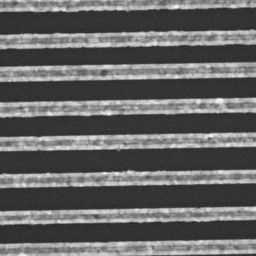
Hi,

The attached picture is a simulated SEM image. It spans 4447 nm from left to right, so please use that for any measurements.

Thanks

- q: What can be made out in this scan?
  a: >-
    parallel lines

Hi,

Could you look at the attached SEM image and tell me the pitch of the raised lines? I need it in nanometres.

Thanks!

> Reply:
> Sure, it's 607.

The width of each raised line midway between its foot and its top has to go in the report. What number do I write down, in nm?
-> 182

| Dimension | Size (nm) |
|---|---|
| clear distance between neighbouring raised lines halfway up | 419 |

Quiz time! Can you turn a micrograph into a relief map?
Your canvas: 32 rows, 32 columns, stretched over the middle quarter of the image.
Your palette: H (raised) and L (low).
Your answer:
LLLLLLLLLLLLLLLLLLLLLLLLLLHHHHHH
HHHHHHHHHHHHHHHHHHHHHHHHHHHHHHHH
HHHHHHHHHHHHHHHHHHHHHHHHHHHHHHHH
HHHHHHHLLLLLLLLLLLLLLLLLLLLLLLLL
LLLLLLLLLLLLLLLLLLLLLLLLLLLLLLLL
LLLLLLLLLLLLLLLLLLLLLLLLLLLLLLLL
LLLLLLLLLLLLLLLLLLLLLLLLLLLLLLLL
LLLLLLLLLLLLLLLLLLLLLLLLLLLLLLLL
LLLLLLLLLLLLLLLLLLLLLLLLLLLLLLLL
LLLLLLLLLLLLLLLLLLLLLHHHHHHHHHHH
HHHHHHHHHHHHHHHHHHHHHHHHHHHHHHHH
HHHHHHHHHHHHHHHHHHHHHHHHHHHHHHHH
LLLLLLLLLLLLLLLLLLLLLLLLLLLLLLLL
LLLLLLLLLLLLLLLLLLLLLLLLLLLLLLLL
LLLLLLLLLLLLLLLLLLLLLLLLLLLLLLLL
LLLLLLLLLLLLLLLLLLLLLLLLLLLLLLLL
LLLLLLLLLLLLLLLLLLLLLLLLLLLLLLLL
LLLLLLLLLLLLLLLLLLLLLLLLLLLLLLLL
LLHHHHHHHHHHHHHHHHHHHHHHHHHHHHHH
HHHHHHHHHHHHHHHHHHHHHHHHHHHHHHHH
HHHHHHHHHHHHHHHHHHHHHHHHHLLLLLLL
LLLLLLLLLLLLLLLLLLLLLLLLLLLLLLLL
LLLLLLLLLLLLLLLLLLLLLLLLLLLLLLLL
LLLLLLLLLLLLLLLLLLLLLLLLLLLLLLLL
LLLLLLLLLLLLLLLLLLLLLLLLLLLLLLLL
LLLLLLLLLLLLLLLLLLLLLLLLLLLLLLLL
LLLLLLLLLLLLLLLLLLLLLLLLLLLLLLLL
LLLLLLLLLLLLLLHHHHLLLLLHHHHHHHHH
HHHHHHHHHHHHHHHHHHHHHHHHHHHHHHHH
HHHHHHHHHHHHHHHHHHHHHHHHHHHHHHHH
LLLLLLLLLLLLLLLLLLLLLLLLLLLLLLLL
LLLLLLLLLLLLLLLLLLLLLLLLLLLLLLLL